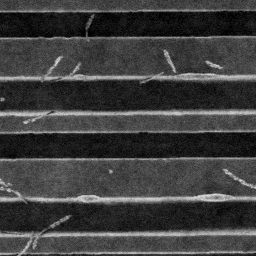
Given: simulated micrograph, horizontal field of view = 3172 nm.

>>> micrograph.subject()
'lines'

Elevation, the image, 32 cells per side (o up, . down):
oooooooooooooooooooooooooooooooo
................................
................................
................................
................................
oooooooooooooooooooooooooooooooo
oooooooooooooooooooooooooooooooo
oooooooooooooooooooooooooooooooo
oooooooooooooooooooooooooooooooo
oooooooooooooooooooooooooooooooo
................................
................................
................................
................................
oooooooooooooooooooooooooooooooo
oooooooooooooooooooooooooooooooo
oooooooooooo....................
................................
................................
................................
oooooooooooooooooooooooooooooooo
oooooooooooooooooooooooooooooooo
oooooooooooooooooooooooooooooooo
oooooooooooooooooooooooooooooooo
oooooooooooooooooooooooooooooooo
................................
................................
................................
................................
...ooooooooooooooooooooooooooooo
oooooooooooooooooooooooooooooooo
oooooooooooooooooooooooooooooooo